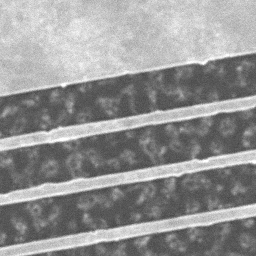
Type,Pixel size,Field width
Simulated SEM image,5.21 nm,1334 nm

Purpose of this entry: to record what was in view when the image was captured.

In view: parallel lines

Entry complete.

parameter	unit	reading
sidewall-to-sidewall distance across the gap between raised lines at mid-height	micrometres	0.226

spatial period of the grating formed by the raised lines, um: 0.279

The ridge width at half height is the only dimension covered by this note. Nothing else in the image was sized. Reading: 57.8 nanometres